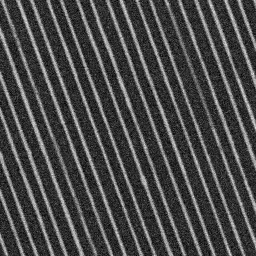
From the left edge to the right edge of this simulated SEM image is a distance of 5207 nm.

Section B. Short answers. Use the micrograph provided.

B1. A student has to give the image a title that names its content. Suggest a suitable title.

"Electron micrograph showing parallel lines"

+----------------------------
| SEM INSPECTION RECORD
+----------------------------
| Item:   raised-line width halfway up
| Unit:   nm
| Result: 54.9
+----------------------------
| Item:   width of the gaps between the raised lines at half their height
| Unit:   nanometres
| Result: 222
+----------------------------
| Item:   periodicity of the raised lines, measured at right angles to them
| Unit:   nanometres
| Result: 282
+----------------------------